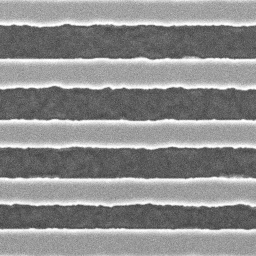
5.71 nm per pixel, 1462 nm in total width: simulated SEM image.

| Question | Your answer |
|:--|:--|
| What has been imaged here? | lines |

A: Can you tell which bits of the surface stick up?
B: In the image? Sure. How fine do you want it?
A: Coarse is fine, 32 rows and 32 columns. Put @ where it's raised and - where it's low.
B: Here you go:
@@@@@@@@@@@@@@@@@@@@@@@@@@@@@@@@
@@@@@@@@@@@@@@@@@@@@@@@@@@@@@@@@
@@@@@@@@@@@@@@@@@@@@@@@@@@@@@@@@
--------------------------------
--------------------------------
--------------------------------
--------------------------------
@@@@@@@@@@@@@@@@@@@@@@@@@@@@@@@@
@@@@@@@@@@@@@@@@@@@@@@@@@@@@@@@@
@@@@@@@@@@@@@@@@@@@@@@@@@@@@@@@@
@@@@@@@@@@@@@@@@@@@@@@@@@@@@@@@@
--------------------------------
--------------------------------
--------------------------------
--------------------------------
@@@@@@@@@@@@@@@@@@@@@@@@@@@@@@@@
@@@@@@@@@@@@@@@@@@@@@@@@@@@@@@@@
@@@@@@@@@@@@@@@@@@@@@@@@@@@@@@@@
---@--@@-----@@-@@@@----@------@
--------------------------------
--------------------------------
--------------------------------
@@@@@@@@@@@@@@@@@@@@@@@@@@@@@@@@
@@@@@@@@@@@@@@@@@@@@@@@@@@@@@@@@
@@@@@@@@@@@@@@@@@@@@@@@@@@@@@@@@
-@-@@@@@@@@@@@@@@--@@@@@@@@@@@@@
--------------------------------
--------------------------------
--------------------------------
@@@@@@@@@@@@@@@@@@@@@@@@@@@@@@@@
@@@@@@@@@@@@@@@@@@@@@@@@@@@@@@@@
@@@@@@@@@@@@@@@@@@@@@@@@@@@@@@@@